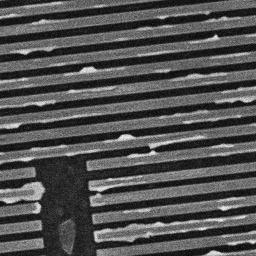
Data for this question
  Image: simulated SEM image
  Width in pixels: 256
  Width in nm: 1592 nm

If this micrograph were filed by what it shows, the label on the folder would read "parallel lines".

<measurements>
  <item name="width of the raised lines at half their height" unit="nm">61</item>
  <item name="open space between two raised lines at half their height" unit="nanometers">49.5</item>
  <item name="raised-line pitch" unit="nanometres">111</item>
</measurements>